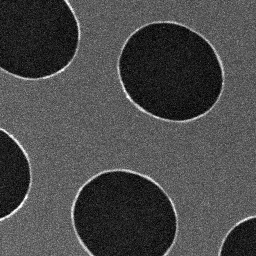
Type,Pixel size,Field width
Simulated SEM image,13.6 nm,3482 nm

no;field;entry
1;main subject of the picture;holes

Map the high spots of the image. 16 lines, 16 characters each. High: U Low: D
DDDDUUUUUUUUUUUU
DDDDDUUUUUDUUUUU
DDDDDUUUDDDDDUUU
DDDDDUUUDDDDDDUU
UDDDUUUDDDDDDDUU
UUUUUUUUDDDDDDUU
UUUUUUUUUDDDDUUU
UUUUUUUUUUUDUUUU
DUUUUUUUUUUUUUUU
DUUUUUUUUUUUUUUU
DDUUUUUUUUUUUUUU
DDUUUDDDDDUUUUUU
DUUUUDDDDDDUUUUU
UUUUUDDDDDDUUUUU
UUUUUDDDDDDUUUDD
UUUUUDDDDDDUUUDD